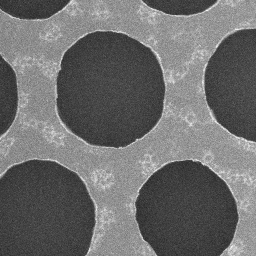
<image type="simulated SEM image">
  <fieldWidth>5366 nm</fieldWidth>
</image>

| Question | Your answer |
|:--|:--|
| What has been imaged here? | holes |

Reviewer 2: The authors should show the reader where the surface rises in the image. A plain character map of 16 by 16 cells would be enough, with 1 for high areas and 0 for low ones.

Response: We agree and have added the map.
0000111111000111
1111111111111111
1111100001111100
1111000000111000
0111000000111000
0111000000111000
0111000000111000
0111000000111100
1111100001111110
1111111111111111
1000111111000111
0000011110000011
0000001110000001
0000001100000001
0000001110000001
0000001110000011